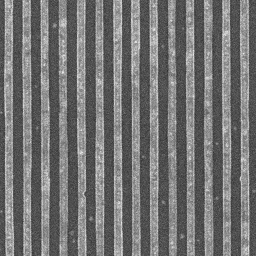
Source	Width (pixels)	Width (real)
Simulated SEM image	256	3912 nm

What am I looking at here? parallel lines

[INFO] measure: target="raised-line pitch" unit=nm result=277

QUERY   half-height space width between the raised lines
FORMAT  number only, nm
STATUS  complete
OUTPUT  170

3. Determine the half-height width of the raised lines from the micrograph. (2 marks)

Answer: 116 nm